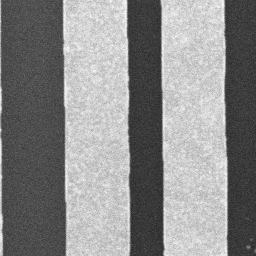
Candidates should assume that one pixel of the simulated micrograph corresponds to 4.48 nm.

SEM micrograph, lines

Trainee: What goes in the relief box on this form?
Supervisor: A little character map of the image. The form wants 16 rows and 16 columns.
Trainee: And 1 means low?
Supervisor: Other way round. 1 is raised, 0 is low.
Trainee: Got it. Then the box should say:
0000111100111100
0000111100111100
0000111100111100
0000111100111100
0000111100111100
0000111100111100
0000111100111100
0000111100111100
0000111100111100
0000111100111100
0000111100111100
0000111100111100
0000111100111100
0000111100111100
0000111100111100
0000111100111100